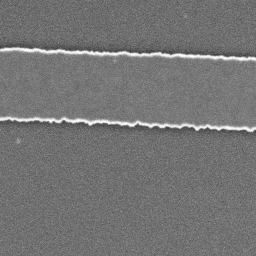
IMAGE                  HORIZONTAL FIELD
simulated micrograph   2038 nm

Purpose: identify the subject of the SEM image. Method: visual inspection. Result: one or a few lines or trenches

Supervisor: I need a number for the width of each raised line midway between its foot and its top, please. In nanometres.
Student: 566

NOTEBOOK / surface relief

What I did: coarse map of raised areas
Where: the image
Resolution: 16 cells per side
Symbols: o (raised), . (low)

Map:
................
................
................
oooooooooooo....
oooooooooooooooo
oooooooooooooooo
oooooooooooooooo
.ooooooooooooooo
................
................
................
................
................
................
................
................